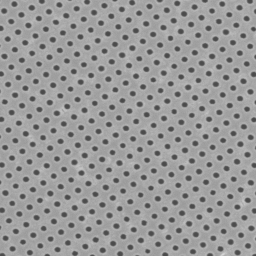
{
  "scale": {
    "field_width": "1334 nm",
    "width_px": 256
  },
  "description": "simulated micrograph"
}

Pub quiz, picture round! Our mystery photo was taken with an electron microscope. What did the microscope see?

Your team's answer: a regular array of holes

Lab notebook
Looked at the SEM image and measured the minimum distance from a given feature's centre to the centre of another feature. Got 63.9 nm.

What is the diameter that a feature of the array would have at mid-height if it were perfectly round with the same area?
28.2 nanometres